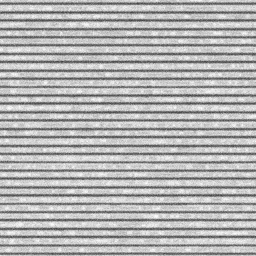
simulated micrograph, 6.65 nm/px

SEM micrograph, parallel lines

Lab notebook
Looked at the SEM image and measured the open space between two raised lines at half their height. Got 20 nm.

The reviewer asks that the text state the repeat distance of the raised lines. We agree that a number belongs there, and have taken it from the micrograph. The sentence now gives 55.4 nm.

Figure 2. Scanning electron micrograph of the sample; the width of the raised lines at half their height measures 33.3 nm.